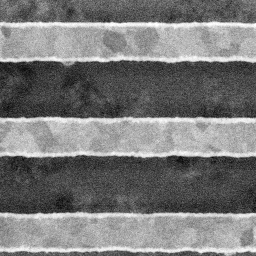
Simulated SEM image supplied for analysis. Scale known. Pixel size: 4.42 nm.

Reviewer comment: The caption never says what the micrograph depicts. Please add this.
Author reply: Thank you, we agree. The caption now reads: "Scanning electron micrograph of lines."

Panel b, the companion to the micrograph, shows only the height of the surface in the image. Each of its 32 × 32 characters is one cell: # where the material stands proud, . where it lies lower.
................................
................................
................................
################################
################################
################################
################################
##############...###############
................................
................................
................................
................................
................................
................................
................................
################################
################################
################################
################################
...####..........##......#...##.
................................
................................
................................
................................
................................
................................
................................
################################
################################
################################
################################
.....................#.....##...